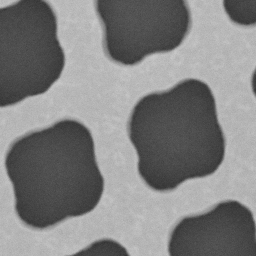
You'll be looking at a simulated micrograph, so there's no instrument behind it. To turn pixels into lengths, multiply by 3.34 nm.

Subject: holes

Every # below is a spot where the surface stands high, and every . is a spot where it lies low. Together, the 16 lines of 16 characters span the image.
...###......##..
....##......###.
....##.....#####
....###..#######
....############
...########..###
.########....###
########......##
#.....##......##
......###.....##
......###.....##
#.....###..#####
#.....##########
#....#######....
###########.....
#####...###.....